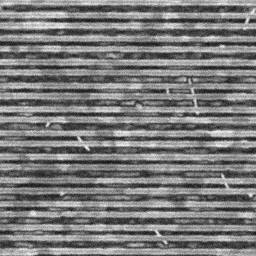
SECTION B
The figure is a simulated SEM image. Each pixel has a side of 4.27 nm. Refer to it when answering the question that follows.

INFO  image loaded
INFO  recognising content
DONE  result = parallel lines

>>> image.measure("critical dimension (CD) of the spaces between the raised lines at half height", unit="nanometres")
27.2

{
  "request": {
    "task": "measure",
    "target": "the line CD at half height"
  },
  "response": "19.2 nm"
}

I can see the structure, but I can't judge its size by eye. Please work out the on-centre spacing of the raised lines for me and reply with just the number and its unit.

0.0503 um